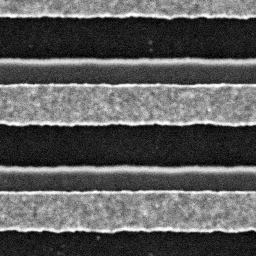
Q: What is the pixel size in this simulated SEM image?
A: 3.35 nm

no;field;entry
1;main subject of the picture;lines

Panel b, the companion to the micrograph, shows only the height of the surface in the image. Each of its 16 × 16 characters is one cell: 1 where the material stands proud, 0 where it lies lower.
1111111111111111
0000000000000000
0000000000000000
0000000000000000
1111111111111111
1111111111111111
1111111111111111
1111111111111111
0000000000000000
0000000000000000
0000000000000000
1111111111111111
1111111111111111
1111111111111111
0001001000000010
0000000000000000